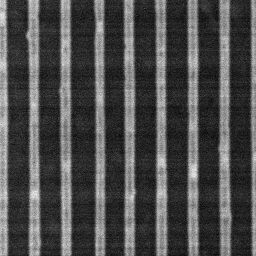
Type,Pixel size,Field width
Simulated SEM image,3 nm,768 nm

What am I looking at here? parallel lines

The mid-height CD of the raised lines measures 24.4 nm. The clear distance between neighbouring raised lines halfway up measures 0.071 microns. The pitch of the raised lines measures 95.5 nanometers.